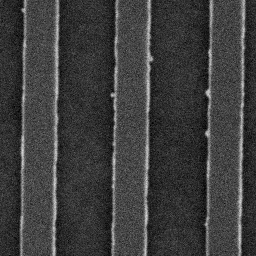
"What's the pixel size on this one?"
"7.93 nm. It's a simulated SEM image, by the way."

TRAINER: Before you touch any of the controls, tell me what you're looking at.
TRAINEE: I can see lines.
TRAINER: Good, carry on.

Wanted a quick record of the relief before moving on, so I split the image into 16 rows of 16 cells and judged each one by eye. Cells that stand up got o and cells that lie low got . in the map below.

..oo...oo....oo.
..oo...oo....oo.
..oo...oo....oo.
..oo...oo....oo.
..oo...oo....oo.
..oo...oo....oo.
.ooo...oo....oo.
.ooo...oo....oo.
.ooo...oo....oo.
.ooo...oo....oo.
.oo....oo....oo.
.oo....oo....oo.
.oo....oo....oo.
.oo....oo....oo.
.oo....oo....oo.
.oo....oo....oo.